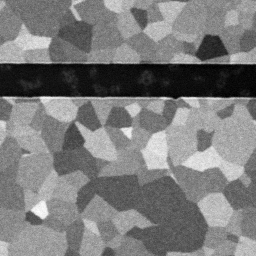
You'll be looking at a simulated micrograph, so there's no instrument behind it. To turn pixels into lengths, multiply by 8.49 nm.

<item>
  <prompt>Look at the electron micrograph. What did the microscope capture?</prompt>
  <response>one or a few lines or trenches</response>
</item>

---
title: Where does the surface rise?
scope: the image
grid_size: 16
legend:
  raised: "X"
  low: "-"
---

XXXXXXXXXXXXXXXX
XXXXXXXXXXXXXXXX
XXXXXXXXXXXXXXXX
XXXXXXXXXXXXXXXX
----------------
----------------
XXXXXXXXXXXXXXXX
XXXXXXXXXXXXXXXX
XXXXXXXXXXXXXXXX
XXXXXXXXXXXXXXXX
XXXXXXXXXXXXXXXX
XXXXXXXXXXXXXXXX
XXXXXXXXXXXXXXXX
XXXXXXXXXXXXXXXX
XXXXXXXXXXXXXXXX
XXXXXXXXXXXXXXXX